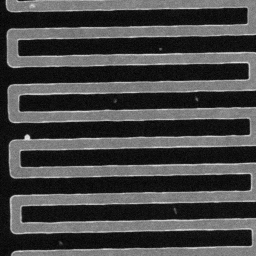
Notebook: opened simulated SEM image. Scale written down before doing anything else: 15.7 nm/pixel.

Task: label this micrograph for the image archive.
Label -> groups of lines, slits or small figures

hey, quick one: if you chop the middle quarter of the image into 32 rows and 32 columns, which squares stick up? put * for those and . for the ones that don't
.******.........................
................................
................................
................................
..................****.*********
********************************
********************************
................................
................................
................................
................................
....................************
********************************
********************************
................................
................................
................................
................................
..................**************
********************************
********************************
................................
................................
................................
................................
..........**********************
********************************
********************************
................................
................................
................................
................................